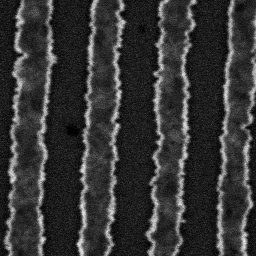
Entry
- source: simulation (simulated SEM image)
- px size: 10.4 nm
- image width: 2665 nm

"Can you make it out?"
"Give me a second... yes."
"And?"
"one or a few lines or trenches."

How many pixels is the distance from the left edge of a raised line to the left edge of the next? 69.2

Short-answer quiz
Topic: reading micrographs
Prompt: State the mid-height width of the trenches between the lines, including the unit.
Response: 428 nm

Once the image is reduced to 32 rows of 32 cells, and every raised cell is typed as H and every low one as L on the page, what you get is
LLLHHHLLLLLLHHHLLLLLHHHHLLLLLHHH
LLHHHHLLLLLLHHHLLLLLHHHHLLLLLHHH
LLLHHHLLLLLLHHHLLLLLHHHHLLLLLHHH
LLHHHHLLLLLLHHHLLLLLHHHHLLLLLHHH
LLHHHHLLLLLLHHHLLLLLHHHLLLLLLHHH
LLHHHHLLLLLHHHHLLLLLHHHLLLLLLHHH
LLLHHHLLLLLHHHLLLLLLHHHLLLLLLHHH
LLHHHHLLLLLHHHLLLLLLHHHLLLLLLHHH
LLHHHHLLLLLHHHHLLLLLHHHLLLLLHHHH
LLHHHHLLLLLHHHHLLLLLHHHLLLLLHHHH
LLHHHHLLLLLHHHHLLLLLHHHLLLLLHHHH
LLHHHHLLLLLHHHHLLLLLHHHLLLLLHHHH
LLHHHHLLLLLHHHHLLLLLHHHLLLLLHHHH
LLHHHHLLLLLHHHHLLLLHHHHLLLLLHHHL
LLHHHHLLLLLHHHLLLLLLHHHLLLLLHHHL
LLHHHLLLLLLHHHLLLLLLHHHLLLLLHHHL
LLHHHLLLLLLHHHLLLLLLHHHLLLLLHHHL
LLHHHLLLLLLHHHLLLLLLHHHLLLLLHHHL
LLHHHHLLLLLHHHLLLLLLHHHLLLLLHHHL
LLHHHHLLLLLHHHLLLLLHHHHLLLLLHHHL
LLHHHLLLLLLHHHLLLLLLHHHLLLLLHHHL
LHHHHLLLLLHHHHLLLLLLHHHLLLLLHHHL
LLHHHLLLLLHHHHLLLLLHHHHLLLLLHHHL
LLHHHLLLLLLHHHLLLLLHHHHLLLLHHHHL
LHHHHLLLLLHHHHLLLLLHHHLLLLLHHHHL
LHHHHLLLLLHHHHLLLLLLHHHLLLLLHHHL
LHHHHLLLLLHHHHLLLLLHHHHLLLLHHHHL
LHHHHLLLLLHHHHLLLLLHHHHLLLLHHHHL
LHHHHLLLLLHHHHLLLLLHHHLLLLLHHHLL
LHHHHLLLLLHHHHLLLLLHHHLLLLLHHHHL
LHHHHLLLLLHHHHLLLLLHHHLLLLLLHHHL
LHHHHLLLLLHHHLLLLLLHHHLLLLLLHHHL